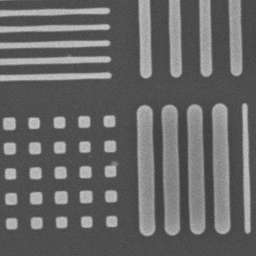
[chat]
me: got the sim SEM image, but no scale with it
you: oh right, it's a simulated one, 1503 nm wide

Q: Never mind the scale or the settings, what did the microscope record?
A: groups of lines, slits or small figures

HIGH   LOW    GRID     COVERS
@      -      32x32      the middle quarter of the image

-------------------@@@-----@@---
-------------------@@@-----@@---
@@@@@@@@@@@@-------@@@-----@@---
@@@@@@--------------------------
--------------------------------
--------------------------------
--------------------------------
--------------------------------
--------------------------------
--------------------------------
-------------------@@----@@-----
------------------@@@@---@@@---@
------------------@@@@--@@@@---@
----@@----@@@-----@@@@--@@@@---@
----@@----@@@-----@@@@---@@@---@
----@@----@@------@@@@---@@@---@
-------------------@@@---@@@---@
-------------------@@@---@@@---@
-------------------@@@---@@@---@
-----------@@------@@@---@@@---@
----@@----@@@------@@@---@@@---@
----@@----@@@------@@@---@@@---@
-------------------@@@---@@@---@
-------------------@@@---@@@---@
-------------------@@@---@@@---@
-------------------@@@---@@@@--@
----@@@---@@@------@@@---@@@@--@
@---@@@---@@@------@@@---@@@@--@
-------------------@@@---@@@@--@
-------------------@@@---@@@@--@
-------------------@@@@--@@@@--@
-------------------@@@@--@@@@--@